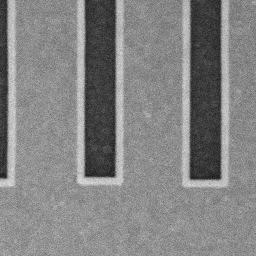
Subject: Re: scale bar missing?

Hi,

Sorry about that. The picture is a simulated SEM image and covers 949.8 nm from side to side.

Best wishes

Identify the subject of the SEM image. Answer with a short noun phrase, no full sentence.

one or a few lines or trenches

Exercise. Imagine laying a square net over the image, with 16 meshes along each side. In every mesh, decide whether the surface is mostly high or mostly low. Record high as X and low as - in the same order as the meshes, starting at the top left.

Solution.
-XXXX--XXXXX--XX
-XXXX--XXXXX--XX
-XXXX--XXXXX--XX
-XXXX--XXXXX--XX
-XXXX--XXXXX--XX
-XXXX--XXXXX--XX
-XXXX--XXXXX--XX
-XXXX--XXXXX--XX
-XXXX--XXXXX--XX
-XXXX--XXXXX--XX
-XXXX--XXXXX--XX
XXXXXXXXXXXXXXXX
XXXXXXXXXXXXXXXX
XXXXXXXXXXXXXXXX
XXXXXXXXXXXXXXXX
XXXXXXXXXXXXXXXX